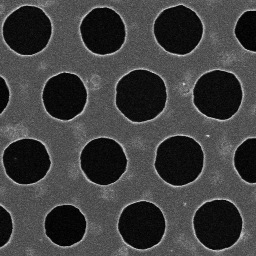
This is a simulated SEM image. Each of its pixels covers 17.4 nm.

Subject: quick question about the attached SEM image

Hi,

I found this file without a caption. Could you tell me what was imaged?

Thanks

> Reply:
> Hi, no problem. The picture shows a regular array of holes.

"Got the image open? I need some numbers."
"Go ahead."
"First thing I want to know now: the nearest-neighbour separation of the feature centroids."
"1300 nm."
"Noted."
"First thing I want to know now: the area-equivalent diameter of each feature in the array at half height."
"838 nanometers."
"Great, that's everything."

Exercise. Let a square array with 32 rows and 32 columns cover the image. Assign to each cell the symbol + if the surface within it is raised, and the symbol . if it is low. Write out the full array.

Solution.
++++++++++++++++++++++++++++++++
++...++++++...++++++....+++++++.
+.....++++.....++++......+++++..
.......+++......+++......++++...
......++++......+++......++++...
+.....+++++....+++++.....+++++..
++...+++++++..+++++++...++++++++
++++++++++++++++++++++++++++++++
++++++++++++++++++++++++++++++++
+++++++...++++++....+++++....+++
.+++++....+++++......+++......++
.++++......+++.......+++......++
.++++......+++.......+++......++
.+++++....+++++.....+++++.....++
++++++...+++++++....++++++...+++
++++++++++++++++++++++++++++++++
++++++++++++++++++++++++++++++++
++...+++++++..+++++++...+++++++.
+.....++++.....+++++.....+++++..
......++++......++++.....++++...
......++++......+++......++++...
+.....++++.....+++++.....+++++..
++...++++++....+++++....+++++++.
++++++++++++++++++++++++++++++++
++++++++++++++++++++++++++++++++
++++++++++++++++...+++++++...+++
.+++++....+++++.....+++++.....++
.+++++.....++++......+++......++
..++++.....++++......+++......++
.+++++....+++++.....+++++.....++
.++++++..+++++++....+++++....+++
++++++++++++++++++++++++++++++++